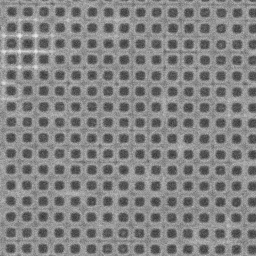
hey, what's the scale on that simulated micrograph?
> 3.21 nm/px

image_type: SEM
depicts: a regular array of holes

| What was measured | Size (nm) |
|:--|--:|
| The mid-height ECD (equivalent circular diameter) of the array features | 34.9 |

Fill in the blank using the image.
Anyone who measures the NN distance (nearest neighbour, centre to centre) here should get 50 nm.